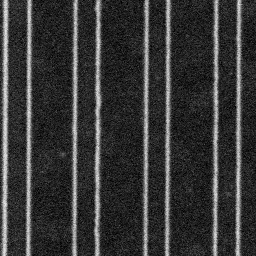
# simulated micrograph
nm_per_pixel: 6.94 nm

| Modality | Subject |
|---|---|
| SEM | one or a few lines or trenches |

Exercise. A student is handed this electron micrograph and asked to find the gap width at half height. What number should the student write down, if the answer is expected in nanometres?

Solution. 157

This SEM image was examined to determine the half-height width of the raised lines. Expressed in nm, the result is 335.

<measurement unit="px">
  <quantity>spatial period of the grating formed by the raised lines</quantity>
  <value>69.9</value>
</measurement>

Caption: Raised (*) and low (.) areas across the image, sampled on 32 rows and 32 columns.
*...******..******...******...**
*...*****...******...******...**
*...*****...******...******...**
*...*****...******...******...**
*...*****...******...******...**
*...*****...******...******...**
*...*****...******...******...**
*...*****...******...******...**
*...*****...******...******...**
*...*****...******...******...**
*...*****...******...******...**
*...*****...******...******...**
*...*****...******...******...**
*...*****...******...******...**
*...*****...******...******...**
*...*****...******...******...**
*...*****...******...******...**
*...*****...******...******...**
*...*****...******...******...**
*...*****...******...******...**
*...*****...******...******...**
*...*****...******...******...**
*...*****...******...******...**
*...*****...******...******...**
*...*****...******...******...**
*...*****...******...******...**
*...*****...******...******...**
*...*****...******...******...**
*...*****...******...******...**
*...*****...******...******...**
*...*****...******...******...**
*...*****...******...******...**